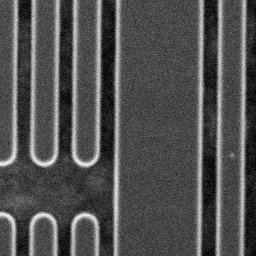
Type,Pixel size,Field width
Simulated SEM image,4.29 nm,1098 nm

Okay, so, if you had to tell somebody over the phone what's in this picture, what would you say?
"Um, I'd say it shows groups of lines, slits or small figures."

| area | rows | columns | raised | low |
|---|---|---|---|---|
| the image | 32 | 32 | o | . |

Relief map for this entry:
oo..ooo..ooo...oooooooooo..oooo.
oo..ooo..ooo...oooooooooo..oooo.
oo..ooo..ooo...oooooooooo..oooo.
oo..ooo..ooo...oooooooooo..oooo.
oo..ooo..ooo...oooooooooo..oooo.
oo..ooo..ooo...oooooooooo..oooo.
oo..ooo..ooo...oooooooooo..oooo.
oo..ooo..ooo...oooooooooo..oooo.
oo..ooo..ooo...oooooooooo..oooo.
oo..ooo..ooo...oooooooooo..oooo.
oo..ooo..ooo...oooooooooo..oooo.
oo..ooo..ooo...oooooooooo..oooo.
oo..ooo..ooo...oooooooooo..oooo.
oo..ooo..ooo...oooooooooo..oooo.
oo..ooo..ooo...oooooooooo..oooo.
oo..ooo..ooo...oooooooooo..ooo..
oo..ooo..ooo...oooooooooo..ooo..
oo..ooo..ooo..ooooooooooo..ooo..
oo..ooo..ooo..ooooooooooo..ooo..
oo..ooo..ooo..ooooooooooo..ooo..
o....o....o...ooooooooooo..ooo..
..............ooooooooooo..ooo..
..............ooooooooooo..ooo..
..............ooooooooooo..ooo..
..............ooooooooooo..ooo..
..............ooooooooooo..ooo..
..............ooooooooooo..ooo..
oo..ooo..ooo..ooooooooooo..ooo..
oo..ooo..ooo..ooooooooooo..ooo..
oo..ooo..ooo..ooooooooooo..ooo..
oo..ooo..ooo..ooooooooooo..ooo..
oo..ooo..ooo..ooooooooooo..ooo..